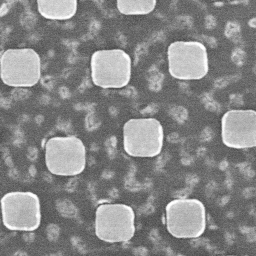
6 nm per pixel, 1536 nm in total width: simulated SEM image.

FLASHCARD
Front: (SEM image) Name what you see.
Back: a regular array of raised bodies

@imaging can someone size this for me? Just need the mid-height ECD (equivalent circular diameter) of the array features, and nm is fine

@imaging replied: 241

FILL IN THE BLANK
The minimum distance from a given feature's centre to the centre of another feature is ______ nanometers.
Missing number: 443